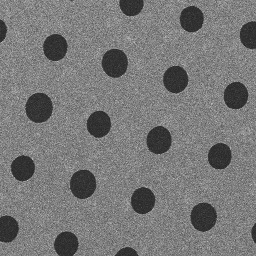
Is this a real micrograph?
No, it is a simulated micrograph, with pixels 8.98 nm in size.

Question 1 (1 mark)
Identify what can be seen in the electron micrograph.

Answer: a regular array of holes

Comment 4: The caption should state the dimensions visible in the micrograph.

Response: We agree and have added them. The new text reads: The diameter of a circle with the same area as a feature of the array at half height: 231 nm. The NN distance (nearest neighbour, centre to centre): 62.2 pixels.